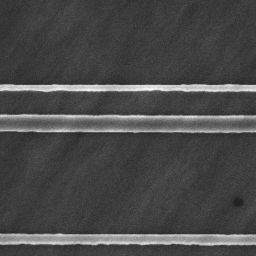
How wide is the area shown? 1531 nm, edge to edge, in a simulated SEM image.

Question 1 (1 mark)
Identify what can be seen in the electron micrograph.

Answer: lines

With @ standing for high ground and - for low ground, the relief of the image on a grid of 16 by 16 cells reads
----------------
----------------
----------------
----------------
----------------
@@@@@@@@@@@@@@@@
@@@@@@@@@@@@@@@@
@@@@@@@@@@@@@@@@
----------------
----------------
----------------
----------------
----------------
----------------
----------------
@@@@@@@@@@@@@@@@